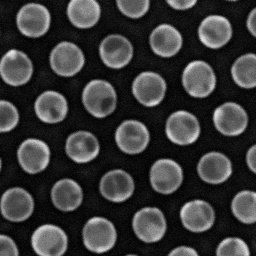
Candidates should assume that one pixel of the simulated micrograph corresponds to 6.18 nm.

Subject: a regular array of raised bodies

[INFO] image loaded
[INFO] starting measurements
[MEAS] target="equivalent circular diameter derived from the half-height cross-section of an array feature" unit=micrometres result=0.199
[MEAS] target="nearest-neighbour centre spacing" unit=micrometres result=0.307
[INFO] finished